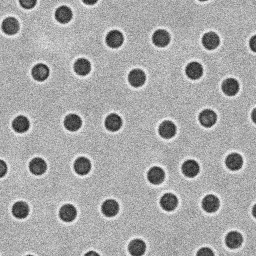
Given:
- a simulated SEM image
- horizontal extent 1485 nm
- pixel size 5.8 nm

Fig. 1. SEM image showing a regular array of holes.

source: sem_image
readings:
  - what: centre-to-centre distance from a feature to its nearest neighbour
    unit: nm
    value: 246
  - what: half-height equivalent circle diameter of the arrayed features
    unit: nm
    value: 109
